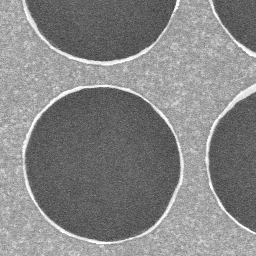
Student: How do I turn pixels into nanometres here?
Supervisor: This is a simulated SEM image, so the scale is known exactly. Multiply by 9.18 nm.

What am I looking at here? holes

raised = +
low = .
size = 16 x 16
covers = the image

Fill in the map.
++.........++...
++.........+++..
+++.......+++++.
++++....++++++++
++++++++++++++++
+++++..+++++++++
+++......+++++..
++........++++..
++.........++...
++.........++...
++.........++...
++.........++...
++.........+++..
+++.......++++..
++++.....+++++++
++++++++++++++++